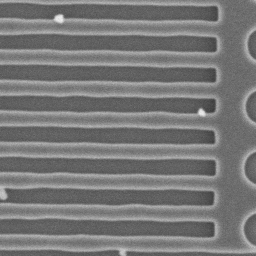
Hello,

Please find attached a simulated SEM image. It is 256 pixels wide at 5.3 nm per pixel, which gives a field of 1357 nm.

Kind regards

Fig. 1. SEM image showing groups of lines, slits or small figures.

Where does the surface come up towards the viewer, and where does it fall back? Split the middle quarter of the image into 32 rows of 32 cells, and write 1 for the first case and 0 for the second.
00000000000000000000001111111111
00000000000000000000000000000000
00000000000000000000000000000000
00000000000000000000000000000000
11111111111111100000000000000000
11111111111111111111111111111111
11111111111111111111111111111111
11111111111111111111111111111111
00000000000000000000000000000000
00000000000000000000000000000000
00000000000000000000000000000000
00000000000000000000000000000000
11111111111111111111111111110000
11111111111111111111111111111111
11111111111111111111111111111111
11111111111111111111111111111111
00000000000000000000000000000000
00000000000000000000000000000000
00000000000000000000000000000000
00000000000000000000000000000000
11111111111111111111111111111111
11111111111111111111111111111111
11111111111111111111111111111111
00000000000000001111111111000011
00000000000000000000000000000000
00000000000000000000000000000000
00000000000000000000000000000000
10000000000000000000000000000000
11111111111111111111111111111111
11111111111111111111111111111111
11111111111111111111111111111111
00000000000000000000000000000000